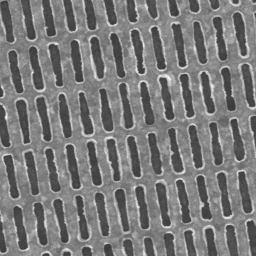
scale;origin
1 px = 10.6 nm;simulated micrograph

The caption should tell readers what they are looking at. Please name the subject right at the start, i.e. a regular array of holes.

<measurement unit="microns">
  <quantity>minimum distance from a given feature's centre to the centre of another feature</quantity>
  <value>0.218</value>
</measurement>